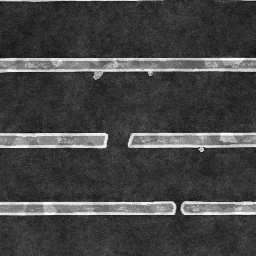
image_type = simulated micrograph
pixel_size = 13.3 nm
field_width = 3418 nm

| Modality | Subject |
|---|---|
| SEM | one or a few lines or trenches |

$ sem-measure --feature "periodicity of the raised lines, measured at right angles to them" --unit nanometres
959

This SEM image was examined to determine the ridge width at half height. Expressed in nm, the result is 158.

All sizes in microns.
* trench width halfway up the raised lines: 0.781